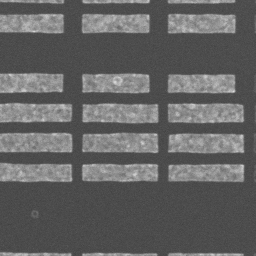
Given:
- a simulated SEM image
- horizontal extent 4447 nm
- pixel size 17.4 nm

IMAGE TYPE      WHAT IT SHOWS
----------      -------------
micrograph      wiring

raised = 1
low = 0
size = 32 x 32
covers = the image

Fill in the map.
00000000000000000000000000000000
00000000000000000000000000000000
11111111001111111110011111111000
11111111001111111110011111111000
00000000000000000000000000000000
00000000000000000000000000000000
00000000000000000000000000000000
00000000000000000000000000000000
00000000000000000000000000000000
11111111000111111100011111111000
11111111001111111110011111111000
00000000000000011100010110110000
00000000000000000000000000000000
11111111101111111111011111111100
11111111101111111111011111111100
00000000000000000000000000000000
00000000000000000000000000000000
11111111101111111111011111111100
11111111101111111111011111111100
00000000000000000000000000000000
00000000000000000000000000000000
11111111101111111111011111111100
11111111100111111110011111111100
00000000000000000000000000000000
00000000000000000000000000000000
00000000000000000000000000000000
00000000000000000000000000000000
00000000000000000000000000000000
00000000000000000000000000000000
00000000000000000000000000000000
00000000000000000000000000000000
00000000000000000000000000000000